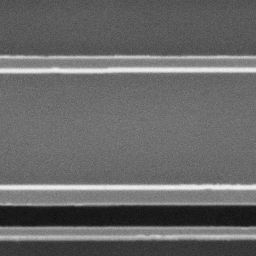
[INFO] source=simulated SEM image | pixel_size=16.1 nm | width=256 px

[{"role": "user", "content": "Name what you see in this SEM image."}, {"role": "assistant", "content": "lines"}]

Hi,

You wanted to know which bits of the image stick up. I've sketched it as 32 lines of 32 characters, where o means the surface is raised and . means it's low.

................................
................................
................................
................................
................................
................................
................................
oooooooooooooooooooooooooooooooo
oooooooooooooooooooooooooooooooo
................................
................................
................................
................................
................................
................................
................................
................................
................................
................................
................................
................................
................................
................................
................................
oooooooooooooooooooooooooooooooo
oooooooooooooooooooooooooooooooo
................................
................................
oooooooooooooooooooooooooooooooo
oooooooooooooooooooooooooooooooo
................................
................................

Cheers